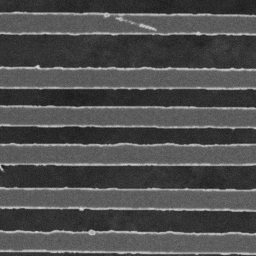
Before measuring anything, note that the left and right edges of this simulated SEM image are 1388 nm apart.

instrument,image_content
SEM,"lines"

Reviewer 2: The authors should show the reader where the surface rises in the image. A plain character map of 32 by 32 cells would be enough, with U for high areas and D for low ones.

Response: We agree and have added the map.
DDDDDDDDDDDDDDDDDDDDDDDDDDDDDDDD
DDDDDDDDDDDDDDDDDDDDDDDDDDDDDDDD
UUUUUUUUUUUUUUUUUUUUUUUUUUUUUUUU
UUUUUUUUUUUUUUUUUUUUUUUUUUUUUUUU
DDDDDDDDDDDDDDDDDDDDDDDDDDDDDDDD
DDDDDDDDDDDDDDDDDDDDDDDDDDDDDDDD
DDDDDDDDDDDDDDDDDDDDDDDDDDDDDDDD
DDDDDDDDDDDDDDDDDDDDDDDDDDDDDDDD
UUUUUDUUDDUUUUUDDUUDDUDDDDDDDDDD
UUUUUUUUUUUUUUUUUUUUUUUUUUUUUUUU
UUUUUUUUUUUUUUUUUUUUUUUUUUUUUUUU
DDDDDDDDDDDDDDDDDDDDDDDDDDDDDDDD
DDDDDDDDDDDDDDDDDDDDDDDDDDDDDDDD
UUUUUUUUUUUUUUUUUUUUUUUUUUUUUUUU
UUUUUUUUUUUUUUUUUUUUUUUUUUUUUUUU
UUUUUUUUUUUUUUUUUUUUUUUUUUUUUUUU
DDDDDDDDDDDDDDDDDDDDDDDDDDDDDDDD
DDDDDDDDDDDDDDDDDDDDDDDDDDDDDDDD
UUUUUUUUUUUUUUUUUUUUUUUUUUUUUUUU
UUUUUUUUUUUUUUUUUUUUUUUUUUUUUUUU
UUUUUUUUUUUUUUUUUUUUUUUUUUUUUUUU
DDDDDDDDDDDDDDDDDDDDDDDDDDDDDDDD
DDDDDDDDDDDDDDDDDDDDDDDDDDDDDDDD
UUUDDDDDUDDDDDDDDDDDDDDDDDDDDDDD
UUUUUUUUUUUUUUUUUUUUUUUUUUUUUUUU
UUUUUUUUUUUUUUUUUUUUUUUUUUUUUUUU
DDDDDDDDDDDDDDDDDDDDDDDDDDDDDDDD
DDDDDDDDDDDDDDDDDDDDDDDDDDDDDDDD
DDDDDDDDDDDDDDDDDDDDDDDDDDDDDDDD
UUUUUUUUUUUUUUUUUUUUUUUUUUUUUUUU
UUUUUUUUUUUUUUUUUUUUUUUUUUUUUUUU
DDDDDDUUUUUUUUUUUUUUUUUUUUUUUUUU